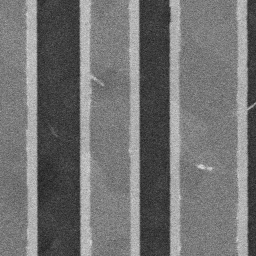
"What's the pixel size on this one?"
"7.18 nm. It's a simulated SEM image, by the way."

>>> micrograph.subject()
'one or a few lines or trenches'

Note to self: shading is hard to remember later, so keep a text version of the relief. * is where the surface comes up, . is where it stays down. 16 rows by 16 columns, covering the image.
**...***...****.
**...***...****.
**...***...****.
**...***...****.
**...***...****.
**...***...****.
**...***...****.
**...***...****.
**...***...****.
**...***...****.
**...***...****.
**...***...****.
**...***...****.
**...***...****.
**...***...****.
**...***...****.